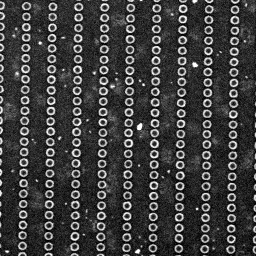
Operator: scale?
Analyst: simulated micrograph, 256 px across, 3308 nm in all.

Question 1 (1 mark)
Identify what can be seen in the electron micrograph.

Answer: a regular array of raised bodies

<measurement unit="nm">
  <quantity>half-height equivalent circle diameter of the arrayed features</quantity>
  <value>98.9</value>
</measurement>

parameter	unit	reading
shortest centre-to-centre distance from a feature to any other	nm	133